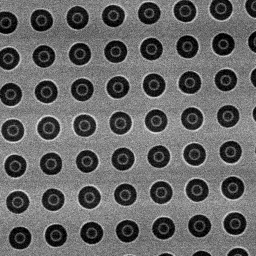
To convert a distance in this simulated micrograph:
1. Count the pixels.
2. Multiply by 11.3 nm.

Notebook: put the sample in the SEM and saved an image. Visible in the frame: an array of small figures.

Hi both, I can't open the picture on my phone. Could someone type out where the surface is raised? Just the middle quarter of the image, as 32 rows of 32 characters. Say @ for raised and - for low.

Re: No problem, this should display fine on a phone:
@@@@-@@@@@@@@@@@@@@@@@@@@@@@@@@@
@@@@@@@@@@@@@@@@@@@@@@@@@@@@@@@@
@@@@@@@@@@@@@@@@@@@@@--@@@@@@@--
@@@@-@@@@@@@---@@@@@-----@@@@---
@@-----@@@@-----@@@@-----@@@----
@@-----@@@-------@@-------@@----
@@------@@------@@@@-----@@@@---
@@-----@@@@-----@@@@-----@@@@@--
@@-----@@@@@--@@@@@@@@-@@@@@@@@@
@@@@-@@@@@@@@@@@@@@@@@@@@@@@@@@@
@@@@@@@@@@@@@@@@@@@@@@@@@@@@@@@@
@@@@@@@@@@@@@@@@@@@@@@--@@@@@@--
@@@@--@@@@@@----@@@@@----@@@@---
@@@----@@@@@-----@@@------@@@---
@@------@@@------@@@------@@@---
@@------@@@------@@@------@@@@--
@@------@@@@-----@@@@----@@@@@@-
@@@----@@@@@@--@@@@@@@@@@@@@@@@@
@@@@@@@@@@@@@@@@@@@@@@@@@@@@@@@@
@@@@@@@@@@@@@@@@@@@@@@@@@@@@@@@@
@@@@@@@@@@@@@@@@@@@@@@@--@@@@@--
@@@@@-@@@@@@@----@@@@-----@@@@--
@@@@----@@@@------@@@------@@@--
@@@------@@@------@@@------@@@--
@@@------@@@------@@@-----@@@@--
@@@------@@@-----@@@@@---@@@@@@@
@@@@----@@@@@---@@@@@@@@@@@@@@@@
@@@@@@@@@@@@@@@@@@@@@@@@@@@@@@@@
@@@@@@@@@@@@@@@@@@@@@@@@@@@@@@@@
@@@@@@@@@@@@@@@@@@@@@@@---@@@@@-
@@@@@--@@@@@@----@@@@@-----@@@--
@@@@-----@@@@-----@@@------@@@--